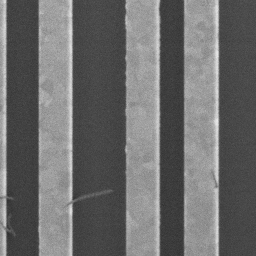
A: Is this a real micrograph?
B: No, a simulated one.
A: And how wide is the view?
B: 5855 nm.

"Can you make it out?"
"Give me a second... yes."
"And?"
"lines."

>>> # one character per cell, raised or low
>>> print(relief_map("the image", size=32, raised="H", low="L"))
HLLLLHHHHLLLLLLLHHHHLLLHHHHLLLLL
HLLLLHHHHLLLLLLLHHHHLLLHHHHLLLLL
HLLLLHHHHLLLLLLLHHHHLLLHHHHLLLLL
HLLLLHHHHLLLLLLLHHHHLLLHHHHLLLLL
HLLLLHHHHLLLLLLLHHHHLLLHHHHLLLLL
HLLLLHHHHLLLLLLLHHHHLLLHHHHLLLLL
HLLLLHHHHLLLLLLLHHHHLLLHHHHLLLLL
HLLLLHHHHLLLLLLLHHHHLLLHHHHLLLLL
HLLLLHHHHLLLLLLLHHHHLLLHHHHLLLLL
HLLLLHHHHLLLLLLLHHHHLLLHHHHLLLLL
HLLLLHHHHLLLLLLLHHHHLLLHHHHLLLLL
HLLLLHHHHLLLLLLLHHHHLLLHHHHLLLLL
HLLLLHHHHLLLLLLLHHHHLLLHHHHLLLLL
HLLLLHHHHLLLLLLLHHHHLLLHHHHLLLLL
HLLLLHHHHLLLLLLLHHHHLLLHHHHLLLLL
HLLLLHHHHLLLLLLLHHHHLLLHHHHLLLLL
HLLLLHHHHLLLLLLLHHHHLLLHHHHLLLLL
HLLLLHHHHLLLLLLLHHHHLLLHHHHLLLLL
HLLLLHHHHLLLLLLLHHHHLLLHHHHLLLLL
HLLLLHHHHLLLLLLLHHHHLLLHHHHLLLLL
HLLLLHHHHLLLLLLLHHHHLLLHHHHLLLLL
HLLLLHHHHLLLLLLLHHHHLLLHHHHLLLLL
HLLLLHHHHLLLLLLLHHHHLLLHHHHLLLLL
HLLLLHHHHLLLLLLLHHHHLLLHHHHLLLLL
HLLLLHHHHLLLLLLLHHHHLLLHHHHLLLLL
HLLLLHHHHLLLLLLLHHHHLLLHHHHLLLLL
HLLLLHHHHLLLLLLLHHHHLLLHHHHLLLLL
HLLLLHHHHLLLLLLLHHHHLLLHHHHLLLLL
HLLLLHHHHLLLLLLLHHHHLLLHHHHLLLLL
HLLLLHHHHLLLLLLLHHHHLLLHHHHLLLLL
HLLLLHHHHLLLLLLLHHHHLLLHHHHLLLLL
HLLLLHHHHLLLLLLLHHHHLLLHHHHLLLLL